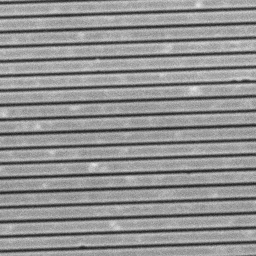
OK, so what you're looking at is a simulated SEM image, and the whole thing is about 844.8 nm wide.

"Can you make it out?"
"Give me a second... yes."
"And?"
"parallel lines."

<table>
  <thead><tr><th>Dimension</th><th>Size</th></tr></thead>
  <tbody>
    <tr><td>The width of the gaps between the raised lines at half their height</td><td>0.0124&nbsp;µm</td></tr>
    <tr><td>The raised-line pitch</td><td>0.0482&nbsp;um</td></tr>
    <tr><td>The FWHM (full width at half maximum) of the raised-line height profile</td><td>36.7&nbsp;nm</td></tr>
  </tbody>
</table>